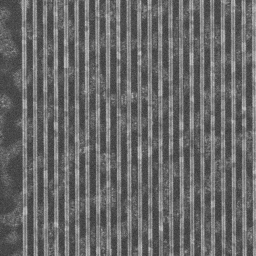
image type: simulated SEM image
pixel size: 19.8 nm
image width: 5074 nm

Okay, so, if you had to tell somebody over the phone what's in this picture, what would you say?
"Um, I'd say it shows parallel lines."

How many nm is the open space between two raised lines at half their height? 151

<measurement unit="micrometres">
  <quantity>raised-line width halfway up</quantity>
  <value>0.0496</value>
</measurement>